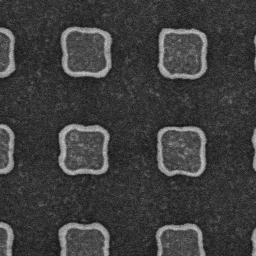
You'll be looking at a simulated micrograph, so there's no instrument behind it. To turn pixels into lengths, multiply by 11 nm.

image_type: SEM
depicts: raised bodies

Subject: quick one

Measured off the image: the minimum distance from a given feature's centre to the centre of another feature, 1060 nm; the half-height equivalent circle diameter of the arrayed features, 49.6 px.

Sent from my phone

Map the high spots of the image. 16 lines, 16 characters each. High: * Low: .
................
................
*...***...***...
*...***...***...
....**....***...
................
................
................
*...***...***...
*...***...***...
....**....***...
................
................
................
*...***...**....
*...***...***...